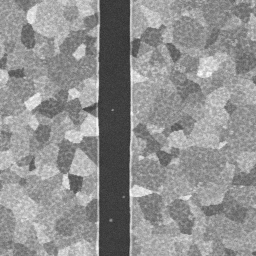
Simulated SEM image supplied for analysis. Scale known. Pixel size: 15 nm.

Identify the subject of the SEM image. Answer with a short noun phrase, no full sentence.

one or a few lines or trenches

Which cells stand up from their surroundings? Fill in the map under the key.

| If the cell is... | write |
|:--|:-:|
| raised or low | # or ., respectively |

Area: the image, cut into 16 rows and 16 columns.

######..########
######..########
######..########
######..########
######..########
######..########
######..########
######..########
######..########
######..########
######..########
######..########
######..########
######..########
######..########
######..########